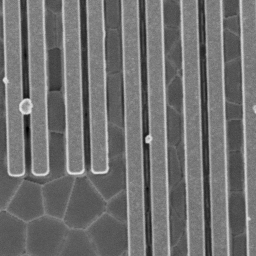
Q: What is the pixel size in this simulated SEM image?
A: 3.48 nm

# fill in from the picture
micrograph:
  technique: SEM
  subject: parallel lines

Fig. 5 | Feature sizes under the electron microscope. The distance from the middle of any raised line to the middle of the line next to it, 0.099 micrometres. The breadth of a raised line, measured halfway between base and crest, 57.8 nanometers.